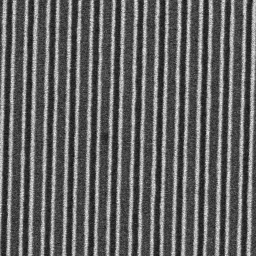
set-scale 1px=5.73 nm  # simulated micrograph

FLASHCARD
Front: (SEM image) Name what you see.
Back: parallel lines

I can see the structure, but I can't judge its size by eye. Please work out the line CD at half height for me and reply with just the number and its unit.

20.1 nm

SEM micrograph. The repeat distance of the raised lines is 62.5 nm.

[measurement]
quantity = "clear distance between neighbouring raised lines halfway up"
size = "34.4 nm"